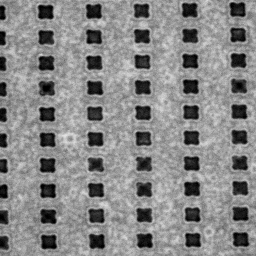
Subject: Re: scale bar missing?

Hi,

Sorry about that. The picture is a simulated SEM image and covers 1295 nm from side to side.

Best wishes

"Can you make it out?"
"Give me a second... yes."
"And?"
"a regular array of holes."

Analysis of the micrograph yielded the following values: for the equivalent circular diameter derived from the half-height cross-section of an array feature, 86.8 nanometres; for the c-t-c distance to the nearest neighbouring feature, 129 nm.